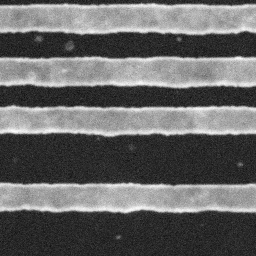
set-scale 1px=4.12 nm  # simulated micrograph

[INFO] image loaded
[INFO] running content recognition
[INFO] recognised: lines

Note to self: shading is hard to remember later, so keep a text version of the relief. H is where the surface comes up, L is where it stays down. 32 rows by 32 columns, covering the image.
LLLLLLLLLLLLLLLLLLLLLLLLLLLLLLLL
HHHHHHHHHHHHHHHHHHHHHHHHHHHHHHHH
HHHHHHHHHHHHHHHHHHHHHHHHHHHHHHHH
HHHHHHHHHHHHHHHHHHHHHHHHHHHHHHHH
LLLLLLLLLLLLLLLLLLLLLLLLLLLLLLLL
LLLLLLLLLLLLLLLLLLLLLLLLLLLLLLLL
LLLLLLLLLLLLLLLLLLLLLLLLLLLLLLLL
HHHHHHHHHHHHHHHHHHHHHHHHHHHHHHHH
HHHHHHHHHHHHHHHHHHHHHHHHHHHHHHHH
HHHHHHHHHHHHHHHHHHHHHHHHHHHHHHHH
HHHHHHHHHHHHHHHHHHHHHHHHHHHHHHHH
LLLLLLLLLLLLLLLLLLLLLLLLLLLLLLLL
LLLLLLLLLLLLLLLLLLLLLLLLLLLLLLLL
HHHHHHHHHHHHHHHHHHHHHHHHHHHHHHHH
HHHHHHHHHHHHHHHHHHHHHHHHHHHHHHHH
HHHHHHHHHHHHHHHHHHHHHHHHHHHHHHHH
HHHHHHHHHHHHHHHHHHHHHHHHHHHHHHHH
LLLLLLLLLLLLLLLLLLLLLLLLLLLLLLLL
LLLLLLLLLLLLLLLLLLLLLLLLLLLLLLLL
LLLLLLLLLLLLLLLLLLLLLLLLLLLLLLLL
LLLLLLLLLLLLLLLLLLLLLLLLLLLLLLLL
LLLLLLLLLLLLLLLLLLLLLLLLLLLLLLLL
LLLLLLLLLLLLLLLLLLLLLLLLLLLLLLLL
HHHHHHHHHHHHHHHHHHHHHHHHHHHHHHHH
HHHHHHHHHHHHHHHHHHHHHHHHHHHHHHHH
HHHHHHHHHHHHHHHHHHHHHHHHHHHHHHHH
LLLLLLLLLLLLLLLLLLLLLLHLLLLLLLLL
LLLLLLLLLLLLLLLLLLLLLLLLLLLLLLLL
LLLLLLLLLLLLLLLLLLLLLLLLLLLLLLLL
LLLLLLLLLLLLLLLLLLLLLLLLLLLLLLLL
LLLLLLLLLLLLLLLLLLLLLLLLLLLLLLLL
LLLLLLLLLLLLLLLLLLLLLLLLLLLLLLLL